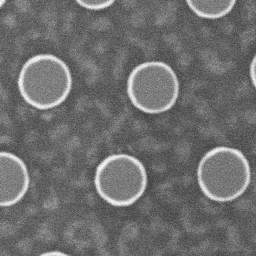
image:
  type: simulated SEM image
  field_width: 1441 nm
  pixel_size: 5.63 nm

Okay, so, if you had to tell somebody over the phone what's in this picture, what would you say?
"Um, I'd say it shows raised bodies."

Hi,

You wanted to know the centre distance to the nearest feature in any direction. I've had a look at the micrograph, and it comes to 565 nanometers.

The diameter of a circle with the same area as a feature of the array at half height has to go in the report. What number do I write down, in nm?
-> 281